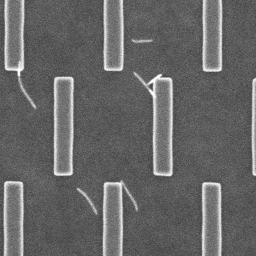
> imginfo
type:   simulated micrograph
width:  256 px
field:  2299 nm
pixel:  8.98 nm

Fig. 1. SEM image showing groups of lines, slits or small figures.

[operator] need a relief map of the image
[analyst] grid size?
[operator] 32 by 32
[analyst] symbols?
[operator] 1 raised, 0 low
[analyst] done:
01100000000001100000000001110000
01100000000001100000000001110000
01100000000001100000000001110000
01100000000001100000000001110000
01100000000001100000000001110000
01100000000001100000000001110000
01100000000001100000000001110000
01100000000001100000000001110000
01100000000001100000000001110000
00000000000000000000000000000000
00000001100000000001100000000000
00000001100000000001100000000000
00000001100000000001100000000000
00000001100000000001100000000000
00000001100000000001100000000000
00000001100000000001100000000000
00000001100000000001100000000000
00000001100000000001100000000000
00000001100000000001100000000000
00000001100000000001100000000000
00000001100000000001100000000000
00000001100000000001100000000000
00000000000000000000000000000000
01100000000001100000000001100000
01100000000001100000000001100000
01100000000001100000000001100000
01100000000001100000000001100000
01100000000001100000000001100000
01100000000001100000000001110000
01100000000001100000000001110000
01100000000001100000000001110000
01100000000001100000000001100000